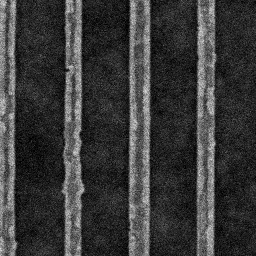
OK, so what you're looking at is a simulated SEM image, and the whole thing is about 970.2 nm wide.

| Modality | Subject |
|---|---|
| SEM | one or a few lines or trenches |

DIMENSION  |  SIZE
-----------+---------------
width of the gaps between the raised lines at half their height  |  187 nm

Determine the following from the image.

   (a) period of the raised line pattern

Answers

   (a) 252 nanometers